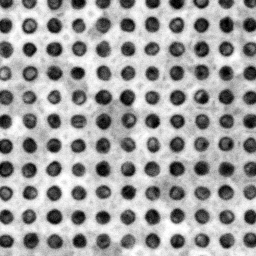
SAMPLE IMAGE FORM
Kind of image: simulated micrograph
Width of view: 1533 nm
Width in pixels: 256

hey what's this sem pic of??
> a regular array of holes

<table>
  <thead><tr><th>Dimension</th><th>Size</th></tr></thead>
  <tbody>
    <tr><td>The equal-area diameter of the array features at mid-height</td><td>97.7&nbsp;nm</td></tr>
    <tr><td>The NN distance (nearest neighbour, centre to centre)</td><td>141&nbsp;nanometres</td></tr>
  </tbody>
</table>